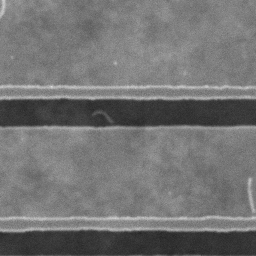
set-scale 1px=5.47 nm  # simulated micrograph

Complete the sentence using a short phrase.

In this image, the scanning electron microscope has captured lines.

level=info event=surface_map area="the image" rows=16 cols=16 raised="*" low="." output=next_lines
****************
****************
****************
****************
****************
****************
................
................
****************
****************
****************
****************
****************
****************
................
................